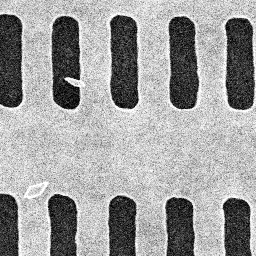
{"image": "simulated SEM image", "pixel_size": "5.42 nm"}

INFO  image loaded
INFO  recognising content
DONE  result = holes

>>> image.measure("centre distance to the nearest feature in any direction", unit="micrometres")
0.312